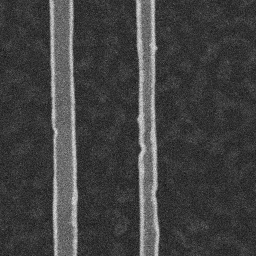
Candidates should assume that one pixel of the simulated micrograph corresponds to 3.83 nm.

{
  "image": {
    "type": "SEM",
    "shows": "one or a few lines or trenches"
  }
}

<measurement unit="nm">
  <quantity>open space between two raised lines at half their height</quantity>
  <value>257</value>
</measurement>